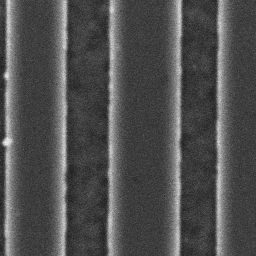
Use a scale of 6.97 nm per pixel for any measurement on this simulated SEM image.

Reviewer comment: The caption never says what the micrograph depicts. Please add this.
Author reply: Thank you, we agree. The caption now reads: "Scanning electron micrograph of lines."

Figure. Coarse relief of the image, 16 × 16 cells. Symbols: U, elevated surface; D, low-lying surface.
UUUUDDDUUUUDDDUU
UUUUDDDUUUUDDDUU
UUUUDDDUUUUDDDUU
UUUUDDDUUUUDDDUU
UUUUDDDUUUUDDDUU
UUUUDDDUUUUDDDUU
UUUUDDDUUUUDDDUU
UUUUDDDUUUUDDDUU
UUUUDDDUUUUDDDUU
UUUUDDDUUUUDDDUU
UUUUDDDUUUUDDDUU
UUUUDDDUUUUDDDUU
UUUUDDDUUUUDDDUU
UUUUDDDUUUUDDDUU
UUUUDDDUUUUDDDUU
UUUUDDDUUUUDDDUU